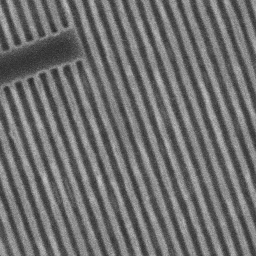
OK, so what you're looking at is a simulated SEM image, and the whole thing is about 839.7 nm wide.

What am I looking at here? parallel lines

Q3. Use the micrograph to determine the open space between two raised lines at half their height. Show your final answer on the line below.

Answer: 24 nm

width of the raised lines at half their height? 18.2 nanometers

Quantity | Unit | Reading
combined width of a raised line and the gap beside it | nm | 42